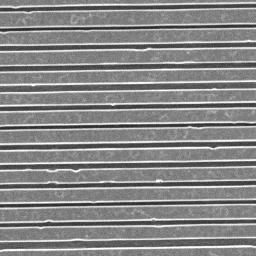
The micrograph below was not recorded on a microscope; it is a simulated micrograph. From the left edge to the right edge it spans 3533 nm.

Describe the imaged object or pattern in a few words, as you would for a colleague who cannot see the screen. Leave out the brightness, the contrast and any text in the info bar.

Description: parallel lines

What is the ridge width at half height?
204 nm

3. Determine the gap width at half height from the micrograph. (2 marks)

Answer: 69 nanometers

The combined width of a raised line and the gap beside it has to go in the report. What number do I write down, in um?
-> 0.27